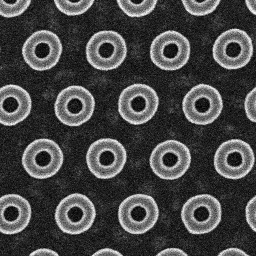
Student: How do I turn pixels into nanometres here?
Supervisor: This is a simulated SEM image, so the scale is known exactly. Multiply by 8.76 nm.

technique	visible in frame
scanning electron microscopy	a regular array of ring-shaped raised bodies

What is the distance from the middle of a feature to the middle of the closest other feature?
549 nm